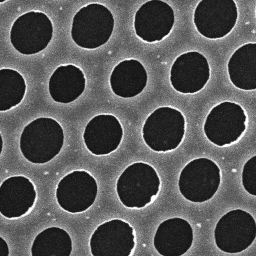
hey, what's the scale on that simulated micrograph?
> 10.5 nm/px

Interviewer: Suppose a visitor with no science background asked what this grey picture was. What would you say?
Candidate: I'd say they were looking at a regular array of holes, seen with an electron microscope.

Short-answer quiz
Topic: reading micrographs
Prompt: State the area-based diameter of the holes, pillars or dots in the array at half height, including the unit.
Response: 445 nanometres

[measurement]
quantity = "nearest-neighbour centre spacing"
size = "645 nm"